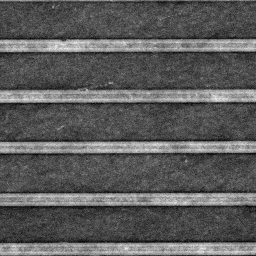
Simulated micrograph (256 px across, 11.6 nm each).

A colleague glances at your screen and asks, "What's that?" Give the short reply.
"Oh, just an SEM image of parallel lines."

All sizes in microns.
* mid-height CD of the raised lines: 0.107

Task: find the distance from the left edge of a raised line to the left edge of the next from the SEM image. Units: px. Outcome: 50.9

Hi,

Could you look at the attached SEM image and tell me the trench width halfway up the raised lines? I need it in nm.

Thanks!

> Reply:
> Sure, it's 480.